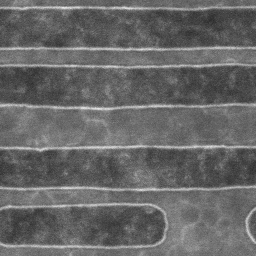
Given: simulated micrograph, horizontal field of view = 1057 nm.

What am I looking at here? one or a few lines or trenches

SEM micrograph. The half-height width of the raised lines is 169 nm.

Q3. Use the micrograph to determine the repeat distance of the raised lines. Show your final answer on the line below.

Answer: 67.1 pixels